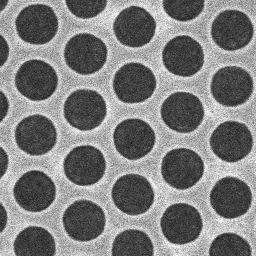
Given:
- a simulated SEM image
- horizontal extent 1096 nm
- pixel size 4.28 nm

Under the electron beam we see a regular array of holes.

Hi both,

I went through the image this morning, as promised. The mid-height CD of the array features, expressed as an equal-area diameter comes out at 41.8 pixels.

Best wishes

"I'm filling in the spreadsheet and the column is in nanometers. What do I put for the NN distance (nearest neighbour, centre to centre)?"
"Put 237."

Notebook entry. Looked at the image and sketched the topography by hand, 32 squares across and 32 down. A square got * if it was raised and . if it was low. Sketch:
.*******.....*******......******
***....**....**...***....***..**
**.....*******.....***..***....*
**.....*******.....*******......
**.....**...**.....***..**......
.***.***.....**...***....**....*
.*******.....*******.....*******
.***.***.....*******.....*******
**.....**....**....**....***..**
**.....*******.....****.***....*
**.....*******......******......
**.....**...**.....***.***......
.***.***.....**...***....**....*
.*******.....*******.....*******
.***.***.....*******.....*******
**.....**....**...***....***..**
**.....*******.....***..***....*
**.....*******.....*******......
***....**...**.....*******.....*
.*******.....**...***....**....*
.*******.....*******.....*******
.**..***.....*******.....*******
**....***...***...***....**...**
**.....*******.....***..***....*
**.....*******.....*******.....*
**....***...**.....***.***.....*
.*******.....**...***....**....*
.*******.....*******.....*******
.**..***.....*******.....*******
**....***...***...***....**...**
**.....*******.....***.***.....*
**.....*******.....*******.....*